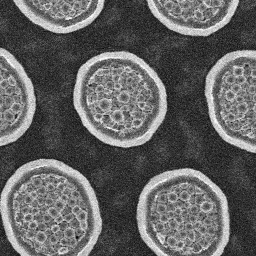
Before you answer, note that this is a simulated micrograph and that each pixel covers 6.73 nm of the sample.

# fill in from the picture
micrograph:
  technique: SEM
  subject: raised bodies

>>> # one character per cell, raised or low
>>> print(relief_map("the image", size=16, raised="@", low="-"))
--@@@@----@@@@--
---@@------@@@--
----------------
---------------@
@----@@@@----@@@
@@---@@@@@---@@@
@@---@@@@@---@@@
@@---@@@@@---@@@
@-----@@@-----@@
----------------
--@@------------
-@@@@-----@@@---
@@@@@@---@@@@@--
@@@@@@---@@@@@--
-@@@@@---@@@@@--
-@@@@-----@@@@--